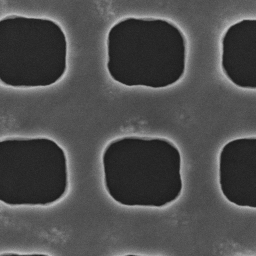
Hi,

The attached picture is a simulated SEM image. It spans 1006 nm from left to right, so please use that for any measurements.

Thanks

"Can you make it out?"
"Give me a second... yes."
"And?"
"holes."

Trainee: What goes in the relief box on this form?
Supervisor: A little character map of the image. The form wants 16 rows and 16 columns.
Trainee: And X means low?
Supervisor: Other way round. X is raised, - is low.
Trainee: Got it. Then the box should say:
XXXXXXXXXXXXXXXX
---XXXX----XXXX-
----XXX-----XX--
----XXX-----XX--
----XXX----XXX--
XXXXXXXXXXXXXXXX
XXXXXXXXXXXXXXXX
XXXXXXXXXXXXXXXX
XXXXXXXXXXXXXXXX
----XXX----XXX--
----XX-----XXX--
----XXX----XXX--
---XXXX----XXX--
XXXXXXXXXXXXXXXX
XXXXXXXXXXXXXXXX
XXXXXXXXXXXXXXXX